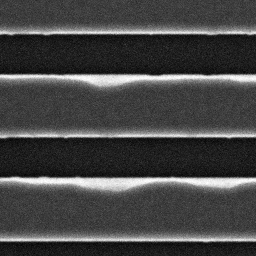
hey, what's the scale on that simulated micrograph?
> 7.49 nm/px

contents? lines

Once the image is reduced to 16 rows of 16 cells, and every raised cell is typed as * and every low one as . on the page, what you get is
****************
****************
................
................
................
****************
****************
****************
****************
................
................
****************
****************
****************
****************
................